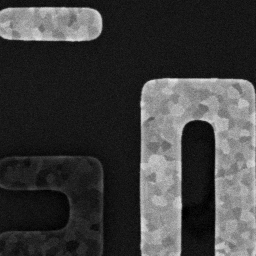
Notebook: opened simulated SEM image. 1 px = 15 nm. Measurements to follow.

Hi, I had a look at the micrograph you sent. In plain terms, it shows wiring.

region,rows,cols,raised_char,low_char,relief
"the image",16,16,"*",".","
................
******..........
.*****..........
................
................
.........*******
.........*******
.........*******
.........**..***
.........**..***
******...**..***
******...**..***
....**...**..***
....**...**..***
.*****...**..***
******...**..***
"